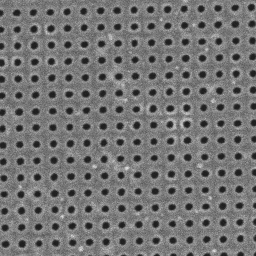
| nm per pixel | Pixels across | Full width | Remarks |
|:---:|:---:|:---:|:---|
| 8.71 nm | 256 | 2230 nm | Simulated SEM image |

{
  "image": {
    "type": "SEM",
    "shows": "a regular array of holes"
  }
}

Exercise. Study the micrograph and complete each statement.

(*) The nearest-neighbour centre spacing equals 0.142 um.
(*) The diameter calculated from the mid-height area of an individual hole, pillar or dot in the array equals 7.22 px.